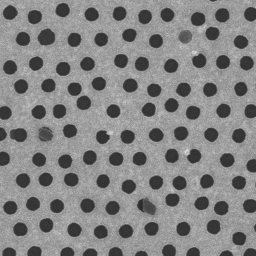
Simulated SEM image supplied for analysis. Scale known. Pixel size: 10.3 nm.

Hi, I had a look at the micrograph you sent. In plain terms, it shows a regular array of holes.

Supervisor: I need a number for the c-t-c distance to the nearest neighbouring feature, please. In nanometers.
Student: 239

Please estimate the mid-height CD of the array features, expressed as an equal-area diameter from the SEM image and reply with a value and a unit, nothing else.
146 nm